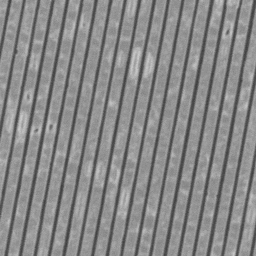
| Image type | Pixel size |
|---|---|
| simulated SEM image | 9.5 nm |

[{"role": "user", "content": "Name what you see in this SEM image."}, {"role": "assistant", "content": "parallel lines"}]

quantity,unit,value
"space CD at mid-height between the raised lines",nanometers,35.1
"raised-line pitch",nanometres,134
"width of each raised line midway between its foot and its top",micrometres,0.0946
